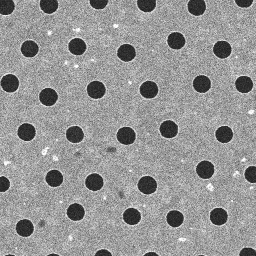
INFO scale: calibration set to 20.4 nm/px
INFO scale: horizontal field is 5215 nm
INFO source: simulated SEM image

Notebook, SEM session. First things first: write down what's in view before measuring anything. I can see a regular array of holes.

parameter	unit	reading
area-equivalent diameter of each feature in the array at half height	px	18.3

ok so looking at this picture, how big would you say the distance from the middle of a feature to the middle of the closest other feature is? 828 nanometers